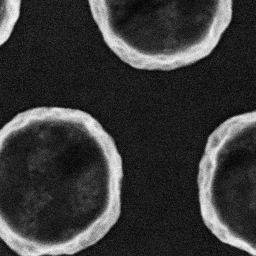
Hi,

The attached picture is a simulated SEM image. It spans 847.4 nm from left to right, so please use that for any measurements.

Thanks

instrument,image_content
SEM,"raised bodies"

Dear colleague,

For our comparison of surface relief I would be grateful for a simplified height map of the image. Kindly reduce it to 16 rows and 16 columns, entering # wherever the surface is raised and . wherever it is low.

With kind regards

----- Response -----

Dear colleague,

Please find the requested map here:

#.....########..
#.....########..
.......######...
........####....
................
................
................
.####..........#
######........##
#######......###
#######......###
#######......###
#######......###
#######......###
######........##
..##............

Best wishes